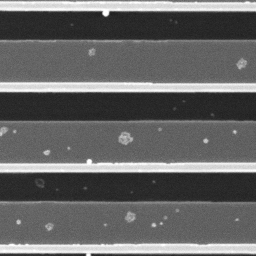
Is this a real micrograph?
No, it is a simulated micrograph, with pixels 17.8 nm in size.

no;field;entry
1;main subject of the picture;lines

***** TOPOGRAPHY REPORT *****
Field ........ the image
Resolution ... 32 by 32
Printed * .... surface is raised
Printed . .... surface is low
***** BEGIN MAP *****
********************************
.............*..................
................................
................................
................................
********************************
********************************
********************************
********************************
********************************
********************************
................................
................................
................................
................................
********************************
********************************
********************************
********************************
********************************
********************************
................................
................................
................................
................................
********************************
********************************
********************************
********************************
********************************
********************************
********************************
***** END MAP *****